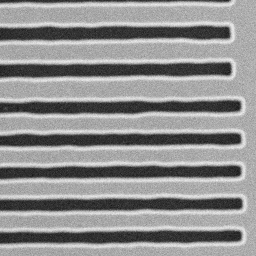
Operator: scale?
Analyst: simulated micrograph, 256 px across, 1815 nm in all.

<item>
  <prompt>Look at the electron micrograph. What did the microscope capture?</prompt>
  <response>groups of lines, slits or small figures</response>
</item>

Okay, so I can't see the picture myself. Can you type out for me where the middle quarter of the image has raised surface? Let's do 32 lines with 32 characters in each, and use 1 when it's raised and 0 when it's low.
00000000000000000000000000000000
00000000000000000000000000000000
00000000000000000000000000000000
00000000000000011111111111100011
11111111111111111111111111111111
11111111111111111111111111111111
11111111111111111111111111111111
11111111111111111111111111111111
11111111111111111111111111111111
00000000000000000000000000000000
00000000000000000000000000000000
00000000000000000000000000000000
00000000000000000000111111111111
11111111111111111111111111111111
11111111111111111111111111111111
11111111111111111111111111111111
11111111111111111111111111111111
00000000000000000000000000000000
00000000000000000000000000000000
00000000000000000000000000000000
00000000000000000000000000000000
11111111111111111111111111111111
11111111111111111111111111111111
11111111111111111111111111111111
11111111111111111111111111111111
00000000000000000000000000000000
00000000000000000000000000000000
00000000000000000000000000000000
00000000000000000000000000000000
11111111111111111111111111111111
11111111111111111111111111111111
11111111111111111111111111111111